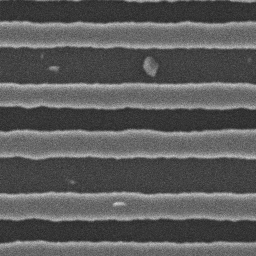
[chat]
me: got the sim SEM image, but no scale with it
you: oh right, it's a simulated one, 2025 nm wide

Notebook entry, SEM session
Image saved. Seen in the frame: lines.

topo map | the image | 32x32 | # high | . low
................................
................................
................................
################################
################################
################################
................................
................................
................................
................................
##........#....####....########.
################################
################################
............###...####.#.####..#
................................
................................
#####################...########
################################
################################
################################
................................
................................
................................
................................
################################
################################
################################
.##...###########..........#####
................................
................................
################################
################################